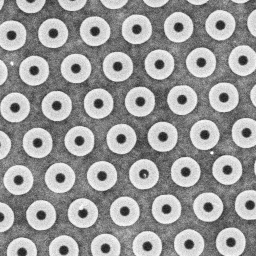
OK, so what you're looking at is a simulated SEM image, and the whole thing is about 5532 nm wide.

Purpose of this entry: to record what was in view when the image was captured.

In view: an array of small figures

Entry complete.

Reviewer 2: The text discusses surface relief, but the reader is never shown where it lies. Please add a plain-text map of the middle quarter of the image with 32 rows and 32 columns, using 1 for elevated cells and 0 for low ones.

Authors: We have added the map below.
11111110001111111000111111100001
11111110001111111000011111100001
11111100001111111000011111100000
11111100000111110000000110000000
00110000000000000000000000000000
00000000000000000000000000000010
00000001110000000111100000011111
00000011111000001111110000111111
10000111111100011111111000111111
11000111111100011111111000111111
11000111111100001111110000111111
11000111111100001111110000011111
10000011111000000111100000001110
00000000100000000000000000000000
00000000000000000000000000000000
00000000000001110000001111100000
00111100000111111000011111110000
01111110000111111100011111110000
11111110000111111100011111110000
11111110000111111100011111110000
11111110000111111000001111110000
01111110000011111000000111000000
00111100000000000000000000000000
00000000000000000000000000000111
00000000110000000011110000001111
10000001111100000111111000011111
11000011111110000111111000011111
11100011111110001111111100011111
11100011111110000111111100011111
11100011111110000111111000001111
11000001111100000011110000000110
10000000110000000000000000000000